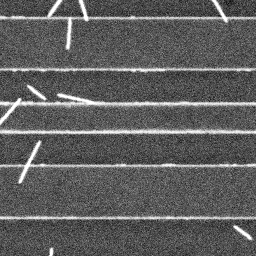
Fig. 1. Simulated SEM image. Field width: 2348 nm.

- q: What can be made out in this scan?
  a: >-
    lines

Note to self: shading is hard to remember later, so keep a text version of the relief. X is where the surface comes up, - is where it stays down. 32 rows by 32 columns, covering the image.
--------------------------------
--------------------------------
XXXXXXXXXXXXXXXXXXXXXXXXXXXXXXXX
XXXXXXXXXXXXXXXXXXXXXXXXXXXXXXXX
XXXXXXXXXXXXXXXXXXXXXXXXXXXXXXXX
XXXXXXXXXXXXXXXXXXXXXXXXXXXXXXXX
XXXXXXXXXXXXXXXXXXXXXXXXXXXXXXXX
XXXXXXXXXXXXXXXXXXXXXXXXXXXXXXXX
XXXXXXXXXXXXXXXXXXXXXXXXXXXXXXXX
--------------------------------
--------------------------------
--------------------------------
--------------------------------
XXXXXXXXXXXXXXXXXXXXXXXXXXXXXXXX
XXXXXXXXXXXXXXXXXXXXXXXXXXXXXXXX
XXXXXXXXXXXXXXXXXXXXXXXXXXXXXXXX
-XXXXXXXXXXXXX--X-----------X-XX
--------------------------------
--------------------------------
--------------------------------
--------------------------------
XXXXXXXXXXXXXXXXXXXXXXXXXXXXXXXX
XXXXXXXXXXXXXXXXXXXXXXXXXXXXXXXX
XXXXXXXXXXXXXXXXXXXXXXXXXXXXXXXX
XXXXXXXXXXXXXXXXXXXXXXXXXXXXXXXX
XXXXXXXXXXXXXXXXXXXXXXXXXXXXXXXX
XXXXXXXXXXXXXXXXXXXXXXXXXXXXXXXX
--------------------------------
--------------------------------
--------------------------------
--------------------------------
--------------------------------